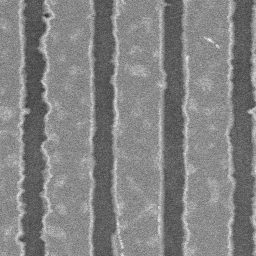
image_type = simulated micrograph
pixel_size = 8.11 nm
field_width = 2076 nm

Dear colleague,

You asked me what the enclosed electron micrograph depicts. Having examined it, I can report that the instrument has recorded one or a few lines or trenches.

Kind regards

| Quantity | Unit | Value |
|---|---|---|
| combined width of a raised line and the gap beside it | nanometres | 565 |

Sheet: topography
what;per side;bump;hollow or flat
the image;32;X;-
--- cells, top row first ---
XXX---XXXXXX--XXXXXXX--XXXXXX---
XXX---XXXXXX--XXXXXX---XXXXXX---
XXX---XXXXXX--XXXXXX---XXXXXX---
XXX---XXXXXX--XXXXXX---XXXXXX---
XXX--XXXXXXX--XXXXXX---XXXXXX---
XXX--XXXXXXX--XXXXXX---XXXXXX---
XXX--XXXXXX---XXXXXX---XXXXXX---
XXX---XXXXXX--XXXXXX---XXXXXX---
XXX---XXXXXX--XXXXXX---XXXXXX---
XXX--XXXXXXX--XXXXXXX--XXXXXX--X
XXX--XXXXXXX--XXXXXXX--XXXXXX---
XXX---XXXXXX--XXXXXX---XXXXXX---
XXX--XXXXXXX--XXXXXX---XXXXXX---
XXX---XXXXXX--XXXXXX---XXXXXX---
XXX---XXXXXX--XXXXXX---XXXXXX---
XXX---XXXXXX--XXXXXX---XXXXXX---
XXX---XXXXXX--XXXXXX---XXXXXX---
XXX---XXXXXX--XXXXXX---XXXXXX---
XXX--XXXXXXX--XXXXXX---XXXXXX---
XXX---XXXXXX--XXXXXX---XXXXXX---
XXX---XXXXXX--XXXXXX---XXXXXX---
XXX---XXXXXX--XXXXXX---XXXXXX---
XXX---XXXXXX--XXXXXX---XXXXXX---
XXX--XXXXXXX--XXXXXX---XXXXXX---
XXX--XXXXXXX--XXXXXX---XXXXXX---
XXX---XXXXX---XXXXXX---XXXXXX---
XXX---XXXXXX---XXXXX---XXXXXX---
XXX--XXXXXXX---XXXXX---XXXXXX--X
XXX--XXXXXX----XXXXX---XXXXXX---
XXX--XXXXXX---XXXXXX---XXXXXX---
XXX---XXXXX---XXXXXX---XXXXXX---
XXX---XXXXXX--XXXXXX---XXXXXX---